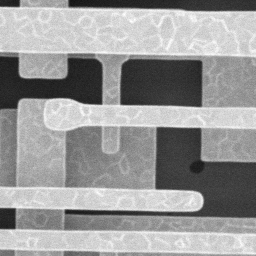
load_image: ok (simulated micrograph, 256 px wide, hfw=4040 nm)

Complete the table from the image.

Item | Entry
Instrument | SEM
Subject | wiring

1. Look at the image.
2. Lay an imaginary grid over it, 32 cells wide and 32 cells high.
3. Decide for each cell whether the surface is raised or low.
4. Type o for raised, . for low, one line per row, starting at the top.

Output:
...ooooo........................
oooooooooooooooooooooooooooooooo
oooooooooooooooooooooooooooooooo
oooooooooooooooooooooooooooooooo
oooooooooooooooooooooooooooooooo
oooooooooooooooooooooooooooooooo
..oooooooooooooooooooooooooooooo
...ooooo....oooo................
..oooooo.....oo.................
...ooooo.....oo.................
.............oo.................
.............oo.................
...oooooo....oo.................
..ooooooooooooooooooooooo.......
..oooooooooooooooooooooooooooooo
..oooooooooooooooooooooooooooooo
..oooooo.....oo.................
..oooooo.....oo.................
..oooooo.....oo.................
..oooooo........................
..oooooo........................
..oooooo........................
..oooooo........................
ooooooooo.......................
ooooooooooooooooooooooooo.......
ooooooooooooooooooooooooo.......
..oooooo........................
..oooooo........................
..oooooo........................
oooooooooooooooooooooooooooooooo
oooooooooooooooooooooooooooooooo
..oooooo....ooo.......oooooooooo